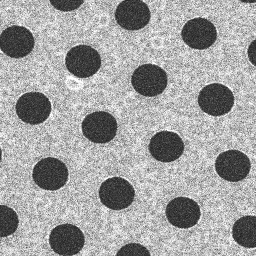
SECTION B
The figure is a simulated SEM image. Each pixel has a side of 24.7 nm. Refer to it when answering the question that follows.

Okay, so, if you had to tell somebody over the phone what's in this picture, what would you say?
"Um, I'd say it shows a regular array of holes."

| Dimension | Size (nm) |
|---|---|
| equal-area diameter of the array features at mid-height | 860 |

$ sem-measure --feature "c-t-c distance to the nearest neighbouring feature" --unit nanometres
1680